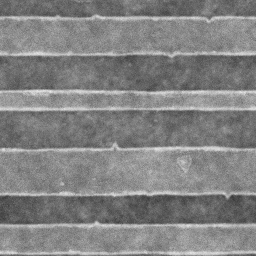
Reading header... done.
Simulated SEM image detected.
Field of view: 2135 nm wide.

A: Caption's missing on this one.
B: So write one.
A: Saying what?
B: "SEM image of one or a few lines or trenches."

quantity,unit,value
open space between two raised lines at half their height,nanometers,305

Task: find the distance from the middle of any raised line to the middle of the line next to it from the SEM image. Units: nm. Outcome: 564